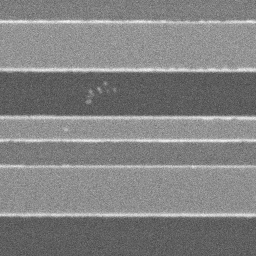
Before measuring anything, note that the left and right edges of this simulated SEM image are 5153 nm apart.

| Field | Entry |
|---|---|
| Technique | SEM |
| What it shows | lines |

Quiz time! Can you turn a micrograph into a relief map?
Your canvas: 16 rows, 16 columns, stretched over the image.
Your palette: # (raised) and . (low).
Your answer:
################
################
################
################
................
................
................
################
################
################
################
################
################
................
................
................